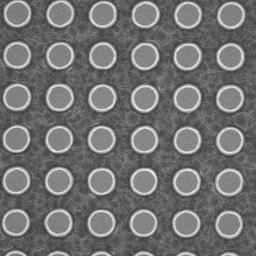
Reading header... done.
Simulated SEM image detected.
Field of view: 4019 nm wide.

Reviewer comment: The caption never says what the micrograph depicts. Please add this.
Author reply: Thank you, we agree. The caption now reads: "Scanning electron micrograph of a regular array of raised bodies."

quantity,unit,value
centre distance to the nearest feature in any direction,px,41.7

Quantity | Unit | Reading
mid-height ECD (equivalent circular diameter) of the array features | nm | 413